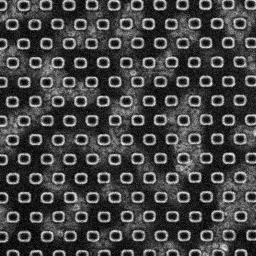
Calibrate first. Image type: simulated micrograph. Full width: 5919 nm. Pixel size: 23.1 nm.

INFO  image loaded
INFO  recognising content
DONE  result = a regular array of raised bodies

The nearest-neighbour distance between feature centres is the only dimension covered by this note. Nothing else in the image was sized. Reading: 510 nanometres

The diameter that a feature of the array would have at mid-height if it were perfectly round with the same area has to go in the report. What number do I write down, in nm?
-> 271